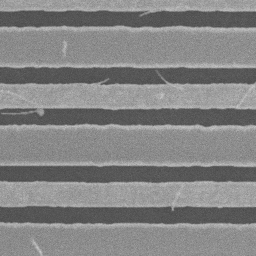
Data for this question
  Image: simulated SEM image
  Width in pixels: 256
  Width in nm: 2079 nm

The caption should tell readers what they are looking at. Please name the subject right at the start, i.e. lines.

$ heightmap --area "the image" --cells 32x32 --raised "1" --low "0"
11111111111111111111111111111111
00000000000000000000000000000000
00000000000000000000000000000000
11011111111111111010111101000000
11111111111111111111111111111111
11111111111111111111111111111111
11111111111111111111111111111111
11111111111111111111111111111111
00000000000000000000000000000000
00000000000000000000000000000000
00000000011100000000010000000000
11111111111111111111111111111111
11111111111111111111111111111111
00000000000001110000000001000011
00000000000000000000000000000000
00000000000000000000000000000000
11111111111111111111111111111111
11111111111111111111111111111111
11111111111111111111111111111111
11111111111111111111111111111111
11111111111111111111111111111111
00000000000000000000000000000000
00000000000000000000000000000000
11111111111111111111111111111111
11111111111111111111111111111111
11111111111111111111111111111111
00000000000000000000000000000000
00000000000000000000000000000000
11111111111111111111111111111111
11111111111111111111111111111111
11111111111111111111111111111111
11111111111111111111111111111111